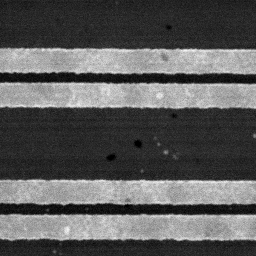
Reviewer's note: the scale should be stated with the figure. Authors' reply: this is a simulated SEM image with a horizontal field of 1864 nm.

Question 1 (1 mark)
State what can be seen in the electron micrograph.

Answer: lines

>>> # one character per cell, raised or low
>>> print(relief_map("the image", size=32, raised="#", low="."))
................................
................................
................................
................................
................................
................................
################################
################################
################################
................................
#############....#..............
################################
################################
................................
................................
................................
................................
................................
................................
................................
................................
................................
................................
################################
################################
................................
................................
################################
################################
################################
................................
................................